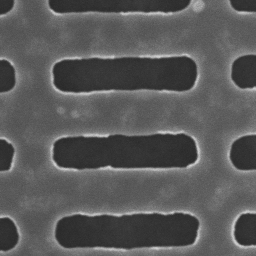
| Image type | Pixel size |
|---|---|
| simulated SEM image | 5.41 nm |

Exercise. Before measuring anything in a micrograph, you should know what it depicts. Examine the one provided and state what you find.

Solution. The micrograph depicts holes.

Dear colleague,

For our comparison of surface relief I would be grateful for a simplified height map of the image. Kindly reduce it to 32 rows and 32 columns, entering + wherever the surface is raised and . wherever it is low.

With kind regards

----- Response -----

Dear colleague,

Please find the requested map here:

..++++..................+++++...
.++++++.....+......+..+++++++++.
++++++++++++++++++++++++++++++++
++++++++++++++++++++++++++++++++
++++++++++++++++++++++++++++++++
++++++++++++++++++++++++++++++++
++++++++++++++++++++++++++++++++
.+++++++................+++++...
..+++++..................++++...
..+++++..................++++...
..+++++.................+++++...
.++++++++..+++++++++++++++++++++
++++++++++++++++++++++++++++++++
++++++++++++++++++++++++++++++++
++++++++++++++++++++++++++++++++
++++++++++++++++++++++++++++++++
++++++++++++++++++++++++++++++++
.++++++.................++++++..
..+++++..................++++...
..+++++..................++++...
.++++++.................+++++...
++++++++++++++++++++++++++++++++
++++++++++++++++++++++++++++++++
++++++++++++++++++++++++++++++++
++++++++++++++++++++++++++++++++
++++++++++++++++++++++++++++++++
++++++++++++++++++++++++++++++++
.+++++++.................+++++..
..+++++..................++++...
..+++++..................++++...
..+++++.................++++++..
++++++++++++++++++++++++++++++++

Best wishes